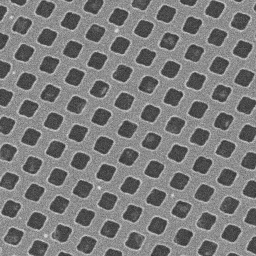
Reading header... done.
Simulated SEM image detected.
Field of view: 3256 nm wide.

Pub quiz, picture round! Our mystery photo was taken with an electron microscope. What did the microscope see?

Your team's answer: a regular array of holes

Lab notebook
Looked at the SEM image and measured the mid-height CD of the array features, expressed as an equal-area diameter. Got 229 nm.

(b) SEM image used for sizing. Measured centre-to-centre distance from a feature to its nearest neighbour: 0.351 µm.